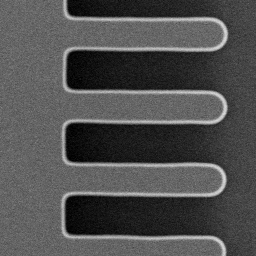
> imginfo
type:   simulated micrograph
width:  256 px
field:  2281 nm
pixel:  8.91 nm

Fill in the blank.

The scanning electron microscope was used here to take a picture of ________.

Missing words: groups of lines, slits or small figures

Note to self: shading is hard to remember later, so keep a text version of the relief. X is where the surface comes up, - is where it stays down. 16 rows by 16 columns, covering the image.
XXXX------------
XXXXXXXXXXXXXX--
XXXXXXXXXXXXXX--
XXXX------------
XXXX------------
XXXX------------
XXXXXXXXXXXXXX--
XXXXXXXXXXXXXX--
XXXX------------
XXXX------------
XXXXXXXXXXXXXX--
XXXXXXXXXXXXXX--
XXXX------------
XXXX------------
XXXX------------
XXXXXXXXXXXXXX--